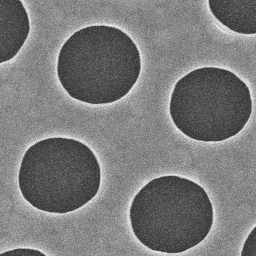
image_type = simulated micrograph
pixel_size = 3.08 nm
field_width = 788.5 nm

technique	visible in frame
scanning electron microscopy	holes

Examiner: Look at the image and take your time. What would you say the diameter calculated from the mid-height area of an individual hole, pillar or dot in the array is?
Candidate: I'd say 0.248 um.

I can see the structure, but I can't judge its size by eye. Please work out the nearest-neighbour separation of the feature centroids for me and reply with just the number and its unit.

0.36 µm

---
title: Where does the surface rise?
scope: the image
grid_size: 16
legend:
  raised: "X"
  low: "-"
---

--XXXXXXXXXXX---
--XXXXXXXXXXXX--
--XX----XXXXXXXX
-XXX-----XXXXXXX
XXXX-----XXX--XX
XXXX----XXX----X
XXXXXX-XXXX-----
XXXXXXXXXXX-----
XXXXXXXXXXXX---X
XX----XXXXXXXXXX
X-----XXXXXXXXXX
X-----XXX---XXXX
XX----XX-----XXX
XXXXXXXX-----XXX
XXXXXXXX-----XXX
XXXXXXXXX---XXX-